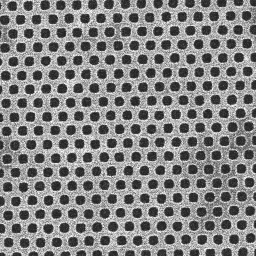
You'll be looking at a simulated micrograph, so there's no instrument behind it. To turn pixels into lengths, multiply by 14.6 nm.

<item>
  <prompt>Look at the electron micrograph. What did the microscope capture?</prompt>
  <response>a regular array of holes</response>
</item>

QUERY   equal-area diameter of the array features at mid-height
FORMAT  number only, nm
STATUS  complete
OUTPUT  155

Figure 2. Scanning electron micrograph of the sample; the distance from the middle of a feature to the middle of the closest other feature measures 228 nm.